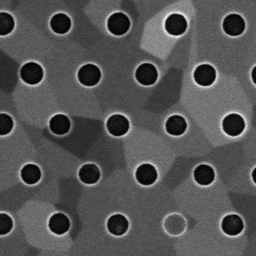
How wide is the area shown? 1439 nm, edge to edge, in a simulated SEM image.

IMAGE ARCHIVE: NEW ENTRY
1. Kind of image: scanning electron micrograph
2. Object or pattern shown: a regular array of holes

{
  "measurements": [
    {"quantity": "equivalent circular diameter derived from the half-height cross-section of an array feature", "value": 0.127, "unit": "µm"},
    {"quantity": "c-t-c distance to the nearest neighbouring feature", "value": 323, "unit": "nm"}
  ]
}